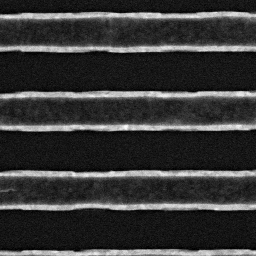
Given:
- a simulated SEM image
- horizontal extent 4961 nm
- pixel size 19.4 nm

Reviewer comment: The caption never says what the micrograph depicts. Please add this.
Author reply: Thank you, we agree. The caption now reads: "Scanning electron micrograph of wiring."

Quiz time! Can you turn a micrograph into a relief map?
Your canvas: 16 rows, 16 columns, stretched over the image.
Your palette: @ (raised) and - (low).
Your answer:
----------------
@@@@@@@@@@@@@@@@
@@@@@@@@@@@@@@@@
----------------
----------------
----------------
@@@@@@@@@@@@@@@@
@@@@@@@@@@@@@@@@
----------------
----------------
----------------
@@@@@@@@@@@@@@@@
@@@@@@@@@@@@@@@@
----------------
----------------
----------------